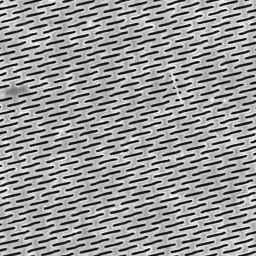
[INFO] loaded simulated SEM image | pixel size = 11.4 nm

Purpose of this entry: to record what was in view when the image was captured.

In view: a regular array of holes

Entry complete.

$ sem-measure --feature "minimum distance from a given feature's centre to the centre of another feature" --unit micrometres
0.144